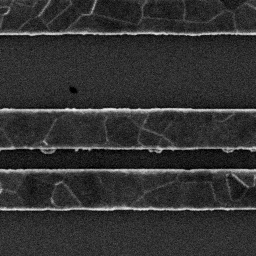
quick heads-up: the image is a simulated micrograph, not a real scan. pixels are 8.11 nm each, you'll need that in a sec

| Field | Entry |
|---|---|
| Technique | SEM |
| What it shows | lines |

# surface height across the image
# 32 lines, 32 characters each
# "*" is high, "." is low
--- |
********************************
********************************
********************************
********************************
................................
................................
................................
................................
................................
................................
................................
................................
................................
................................
********************************
********************************
********************************
********************************
********************************
................................
................................
********************************
********************************
********************************
********************************
********************************
................................
................................
................................
................................
................................
................................